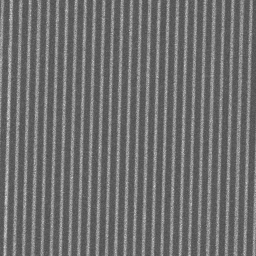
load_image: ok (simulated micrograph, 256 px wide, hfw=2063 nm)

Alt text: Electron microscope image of parallel lines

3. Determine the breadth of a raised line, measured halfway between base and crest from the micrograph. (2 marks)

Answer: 0.0242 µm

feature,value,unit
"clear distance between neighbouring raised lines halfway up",48.3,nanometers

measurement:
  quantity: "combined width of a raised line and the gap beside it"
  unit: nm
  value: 74.2